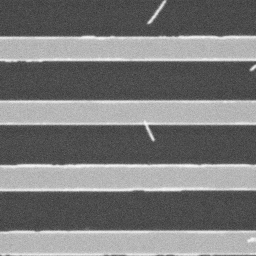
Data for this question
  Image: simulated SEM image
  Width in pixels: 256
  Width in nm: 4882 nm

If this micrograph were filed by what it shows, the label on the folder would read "lines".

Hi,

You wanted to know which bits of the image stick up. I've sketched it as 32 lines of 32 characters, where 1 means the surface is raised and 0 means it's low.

00000000000000000000000000000000
00000000000000000000000000000000
00000000000000000000000000000000
00000000000000000000000000000000
00000000000000000000000000000000
11111111111111111111111111111111
11111111111111111111111111111111
11111111111111111111111111111111
00000000000000000000000000000000
00000000000000000000000000000000
00000000000000000000000000000000
00000000000000000000000000000000
00000000000000000000000000000000
11111111111111111111111111111111
11111111111111111111111111111111
00000000000000000010000000000000
00000000000000000000000000000000
00000000000000000000000000000000
00000000000000000000000000000000
00000000000000000000000000000000
00000000000000000000000000000000
11111111111111111111111111111111
11111111111111111111111111111111
11111111111111111111111111111111
00000000000000000000000000000000
00000000000000000000000000000000
00000000000000000000000000000000
00000000000000000000000000000000
00000000000000000000000000000000
11111111111111111111111111111111
11111111111111111111111111111111
11111111111111111111111111111111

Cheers